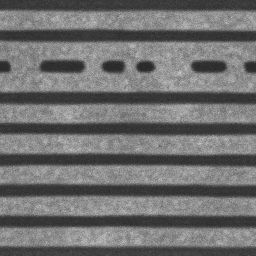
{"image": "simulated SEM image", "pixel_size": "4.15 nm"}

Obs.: parallel lines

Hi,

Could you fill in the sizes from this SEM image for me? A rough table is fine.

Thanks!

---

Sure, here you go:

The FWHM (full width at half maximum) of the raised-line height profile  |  85 nanometers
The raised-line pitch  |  30.9 pixels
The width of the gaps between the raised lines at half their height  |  41 nm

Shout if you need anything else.